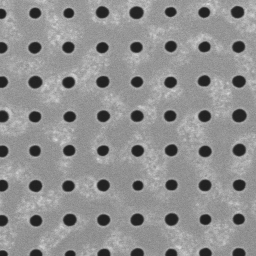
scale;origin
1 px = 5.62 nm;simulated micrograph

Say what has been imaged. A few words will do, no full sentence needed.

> a regular array of holes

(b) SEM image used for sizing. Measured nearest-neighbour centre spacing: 189 nanometres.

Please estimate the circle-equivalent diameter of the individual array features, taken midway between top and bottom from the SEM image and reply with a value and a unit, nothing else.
65.3 nm